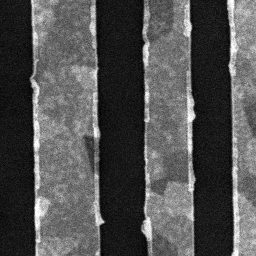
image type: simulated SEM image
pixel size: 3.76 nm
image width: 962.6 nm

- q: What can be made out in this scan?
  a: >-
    one or a few lines or trenches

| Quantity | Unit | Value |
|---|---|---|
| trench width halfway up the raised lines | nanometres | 158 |